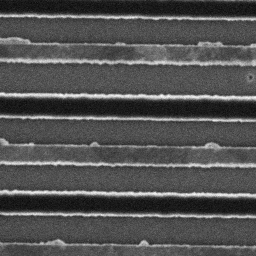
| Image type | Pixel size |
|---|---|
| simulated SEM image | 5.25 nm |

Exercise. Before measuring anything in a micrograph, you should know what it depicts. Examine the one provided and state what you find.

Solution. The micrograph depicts lines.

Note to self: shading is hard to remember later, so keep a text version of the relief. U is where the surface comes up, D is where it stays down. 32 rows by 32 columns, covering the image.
UUUUUUUUUUUUUUUUUUUUUUUUUUUUUUUU
UUUUUUUUUUUUUUUUUUUUUUUUUUUUUUUU
DDDDDDDDDDDDDDDDDDDDDDDDDDDDDDDD
DDDDDDDDDDDDDDDDDDDDDDDDDDDDDDDD
DDDDDDDDDDDDDDDDDDDDDDDDDDDDDDDD
UUUUUUUUDDUDDDDDDDDDDDDDDDDDDDDD
UUUUUUUUUUUUUUUUUUUUUUUUUUUUUUUU
DUUUUUUUUUUUUUUUUUUUUUUUUUUUUUUU
DDDDDDDDDDDDDDDDDDDDDDDDDDDDDDDD
DDDDDDDDDDDDDDDDDDDDDDDDDDDDDDDD
DDDDDDDDDDDDDDDDDDDDDDDDDDDDDDDD
DDDDDDDDDDDDDDDDDDDDDDDDDDDDDDDD
UUUUUUUUUUUUUUUUUUUUUUUUUUUUUUUU
UUUUUUUUUUUUUUUUUUUUUUUUUUUUUUUU
UUUUUUUUUUUUUUUUUUUUUUUUUUUUUUUU
DDDDDDDDDDDDDDDDDDDDDDDDDDDDDDDD
DDDDDDDDDDDDDDDDDDDDDDDDDDDDDDDD
DDDDDDDDDDDDDDDDDDDDDDDDDDDDDDDD
UUUUUUUUUUUUUUUUUUUUUUUUUUUDUDDD
UUUUUUUUUUUUUUUUUUUUUUUUUUUUUUUU
DDDDDDDDDUUUUUUUUUUUUUUUUUUUUUUU
DDDDDDDDDDDDDDDDDDDDDDDDDDDDDDDD
DDDDDDDDDDDDDDDDDDDDDDDDDDDDDDDD
DDDDDDDDDDDDDDDDDDDDDDDDDDDDDDDD
UUUUUUUUUUUUUUUUUUUUUUUUUUUUUUUU
UUUUUUUUUUUUUUUUUUUUUUUUUUUUUUUU
UUUUUUUUUUUUUUUUUUUUUUUUUUUUUUUU
DDDDDDDDDDDDDDDDDDDDDDDDDDDDDDDD
DDDDDDDDDDDDDDDDDDDDDDDDDDDDDDDD
DDDDDDDDDDDDDDDDDDDDDDDDDDDDDDDD
UUUUUUDUDDDDDDDDDDDDDDDDDDDDDDDD
UUUUUUUUUUUUUUUUUUUUUUUUUUUUUUUU